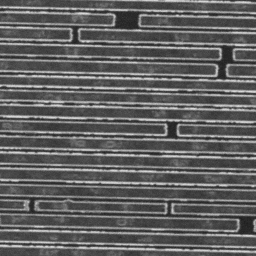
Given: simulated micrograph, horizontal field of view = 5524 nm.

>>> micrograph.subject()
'parallel lines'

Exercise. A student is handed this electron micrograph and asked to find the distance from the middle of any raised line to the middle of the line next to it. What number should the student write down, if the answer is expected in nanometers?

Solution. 337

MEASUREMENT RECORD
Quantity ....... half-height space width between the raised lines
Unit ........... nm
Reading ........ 226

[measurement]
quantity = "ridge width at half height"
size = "113 nm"